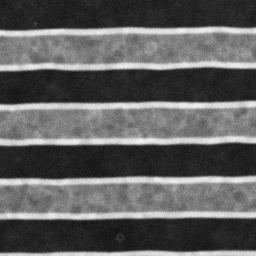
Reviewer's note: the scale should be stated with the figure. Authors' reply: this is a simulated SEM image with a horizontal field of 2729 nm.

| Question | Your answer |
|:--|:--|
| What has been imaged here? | wiring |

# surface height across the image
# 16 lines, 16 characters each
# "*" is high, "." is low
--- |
................
................
****************
****************
................
................
................
****************
****************
................
................
****************
****************
....**..........
................
................